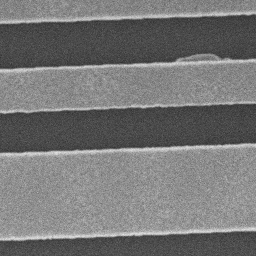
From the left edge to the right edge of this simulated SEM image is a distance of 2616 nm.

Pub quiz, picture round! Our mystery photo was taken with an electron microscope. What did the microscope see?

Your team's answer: lines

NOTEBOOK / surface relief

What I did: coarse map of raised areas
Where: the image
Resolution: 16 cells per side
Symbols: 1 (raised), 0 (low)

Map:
1111111111111111
0000000000000000
0000000000000000
0000000000000000
1111111111111111
1111111111111111
1111111111111110
0000000000000000
0000000000000000
0001111111111111
1111111111111111
1111111111111111
1111111111111111
1111111111111111
1111111111111100
0000000000000000